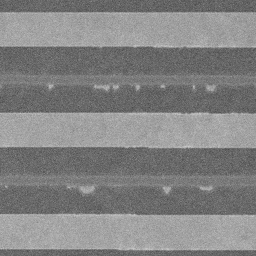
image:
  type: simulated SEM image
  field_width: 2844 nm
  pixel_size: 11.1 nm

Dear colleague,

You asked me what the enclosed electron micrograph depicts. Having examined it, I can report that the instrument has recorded lines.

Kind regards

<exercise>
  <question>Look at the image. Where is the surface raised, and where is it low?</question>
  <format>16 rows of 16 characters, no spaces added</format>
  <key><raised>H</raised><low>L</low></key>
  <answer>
LLLLLLLLLLLLLLLL
HHHHHHHHHHHHHHHH
HHHHHHHHHHHHHHHH
LLLLLLLLLLLLLLLL
LLLLLLLLLLLLLLLL
LLLLLLLLLLLLLLLL
LLLLLLLLLLLLLLLL
HHHHHHHHHHHHHHHH
HHHHHHHHHHHHHHHH
LLLLLLLLLLLLLLLL
LLLLLLLLLLLLLLLL
LLLLLLLLLLLLLLLL
LLLLLLLLLLLLLLLL
HHHHHHHHHHHHHHHH
HHHHHHHHHHHHHHHH
HHHHHHHHHHHHHHHH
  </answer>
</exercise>